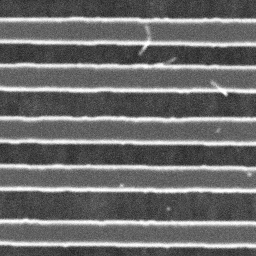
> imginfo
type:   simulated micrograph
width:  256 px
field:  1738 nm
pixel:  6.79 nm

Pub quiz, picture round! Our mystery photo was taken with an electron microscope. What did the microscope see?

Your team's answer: lines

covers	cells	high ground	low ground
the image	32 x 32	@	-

--------------------------------
--------------------------------
@@@@@@@@@@@@@@@@@@@@@@@@@@@@@@@@
@@@@@@@@@@@@@@@@@@@@@@@@@@@@@@@@
@@@@@@@@@@@@@@@@@@@@@@@@@@@@@@@@
------------------@@@@@@@@@@@@@@
--------------------------------
--------------------------------
@@@@@@@@@@@@@@@@@@@@@@@@@@@@@@@@
@@@@@@@@@@@@@@@@@@@@@@@@@@@@@@@@
@@@@@@@@@@@@@@@@@@@@@@@@@@@@@@@@
---------------------------@@-@@
--------------------------------
--------------------------------
--------------------------------
@@@@@@@@@@@@@@@@@@@@@@@@@@@@@@@@
@@@@@@@@@@@@@@@@@@@@@@@@@@@@@@@@
@@@@@@@@@@@@@@@@@@@@@@@@@@@@@@@@
--------------------------------
--------------------------------
--------------------------------
@@@@@@@@@@@@@@@@@@@@@@@@@@@@@@@@
@@@@@@@@@@@@@@@@@@@@@@@@@@@@@@@@
@@@@@@@@@@@@@@@@@@@@@@@@@@@@@@@@
--------------------------------
--------------------------------
--------------------------------
--------------------------------
@@@@@@@@@@@@@@@@@@@@@@@@@@@@@@@@
@@@@@@@@@@@@@@@@@@@@@@@@@@@@@@@@
@@@@@@@@@@@@@@@@@@@@@@@@@@@@@@@@
--------------------------------